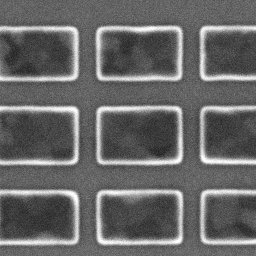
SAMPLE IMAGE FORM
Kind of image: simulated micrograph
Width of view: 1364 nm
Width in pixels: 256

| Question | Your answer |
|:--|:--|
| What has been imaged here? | wiring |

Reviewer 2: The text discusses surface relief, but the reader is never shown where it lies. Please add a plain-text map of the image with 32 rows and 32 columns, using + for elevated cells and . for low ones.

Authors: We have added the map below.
................................
................................
................................
+.+++++++....+++...+++....+..+++
+++++++++...+++++++++++..+++++++
+++++++++...+++++++++++..+++++++
++++++++++..+++++++++++..+++++++
++++++++++..+++++++++++..+++++++
++++++++++..+++++++++++..+++++++
+++++++++...++++++++++...+++++++
................................
................................
................................
+++++..........+++++++....++.+++
++++++++++..+++++++++++..+++++++
++++++++++..+++++++++++..+++++++
++++++++++..+++++++++++..+++++++
++++++++++..+++++++++++..+++++++
++++++++++..+++++++++++..+++++++
++++++++++..+++++++++++..+++++++
................................
................................
................................
................................
+++++++++...+++++++++++..+++++++
++++++++++..+++++++++++..+++++++
++++++++++..+++++++++++..+++++++
++++++++++..+++++++++++..+++++++
++++++++++..+++++++++++..+++++++
++++++++++..+++++++++++..+++++++
................................
................................